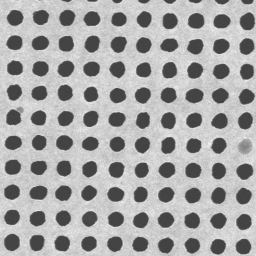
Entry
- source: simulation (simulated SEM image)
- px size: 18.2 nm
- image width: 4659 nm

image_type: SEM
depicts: a regular array of holes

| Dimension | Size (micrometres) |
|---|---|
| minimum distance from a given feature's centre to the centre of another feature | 0.45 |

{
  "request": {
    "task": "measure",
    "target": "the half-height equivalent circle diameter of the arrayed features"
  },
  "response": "288 nm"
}